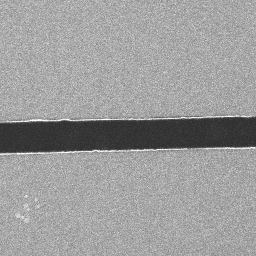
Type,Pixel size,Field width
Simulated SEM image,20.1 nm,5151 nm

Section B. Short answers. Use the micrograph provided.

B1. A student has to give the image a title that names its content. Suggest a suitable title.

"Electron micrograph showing one or a few lines or trenches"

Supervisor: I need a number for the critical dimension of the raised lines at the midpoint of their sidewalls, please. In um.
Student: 0.656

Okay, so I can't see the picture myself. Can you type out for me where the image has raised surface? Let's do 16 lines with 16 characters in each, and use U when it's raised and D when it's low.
DDDDDDDDDDDDDDDD
DDDDDDDDDDDDDDDD
DDDDDDDDDDDDDDDD
DDDDDDDDDDDDDDDD
DDDDDDDDDDDDDDDD
DDDDDDDDDDDDDDDD
DDDDDDDDDDDDDDDD
DDUDUUUUUUUUUUUU
UUUUUUUUUUUUUUUU
UUUUUDDDDDDDDDDD
DDDDDDDDDDDDDDDD
DDDDDDDDDDDDDDDD
DDDDDDDDDDDDDDDD
DDDDDDDDDDDDDDDD
DDDDDDDDDDDDDDDD
DDDDDDDDDDDDDDDD